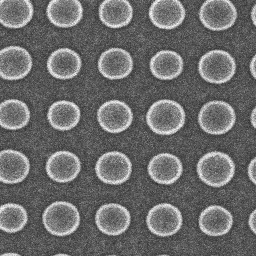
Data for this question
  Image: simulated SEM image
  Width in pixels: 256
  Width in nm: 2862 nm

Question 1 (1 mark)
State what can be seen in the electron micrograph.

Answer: a regular array of raised bodies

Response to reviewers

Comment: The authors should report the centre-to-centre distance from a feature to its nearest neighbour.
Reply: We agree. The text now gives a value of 568 nm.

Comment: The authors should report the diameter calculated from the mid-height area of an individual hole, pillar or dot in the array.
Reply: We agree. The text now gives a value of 348 nm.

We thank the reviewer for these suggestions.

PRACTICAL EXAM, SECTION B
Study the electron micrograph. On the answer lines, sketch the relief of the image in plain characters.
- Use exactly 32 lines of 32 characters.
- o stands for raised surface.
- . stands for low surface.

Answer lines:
oooo..oooo...ooo...ooo....ooo...
oooo..oooo...ooo...oooo..oooo...
oooo..oooo...ooo...oooo..oooo...
..........................oo....
................................
................................
ooo....oo....ooo....o.....oo....
oooo..oooo...ooo...oooo..oooo...
oooo..oooo...ooo...oooo..oooo...
ooo....oo....oo.....oo...oooo...
................................
................................
................................
ooo...oooo...ooo...oooo..oooo...
ooo...oooo..oooo...oooo..oooo...
ooo....oo....ooo...oooo..oooo...
..............o.....oo....oo....
................................
................................
ooo....oo....oo.....o.....oo....
ooo...oooo..oooo...ooo...oooo..o
ooo...oooo..oooo...oooo..oooo..o
ooo....oo....oo....ooo...ooo....
................................
................................
.......o........................
ooo...oooo..oooo...ooo....oo....
ooo...oooo..oooo...oooo..oooo..o
ooo...ooo....ooo...ooo...oooo..o
................................
................................
................................